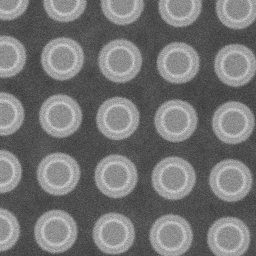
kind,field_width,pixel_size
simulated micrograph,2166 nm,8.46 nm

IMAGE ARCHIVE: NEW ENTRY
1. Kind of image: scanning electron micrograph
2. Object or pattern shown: an array of small figures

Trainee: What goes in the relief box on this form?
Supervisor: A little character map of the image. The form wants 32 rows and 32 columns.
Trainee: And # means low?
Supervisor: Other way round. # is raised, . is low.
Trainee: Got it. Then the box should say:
###...#####..#####..#####..#####
###...####...#####..#####..#####
.......##.....###....###....####
.............................#..
................................
###...####...####....##.........
###..#####...####...####...#####
###..#####..######..#####..#####
###..#####...#####..#####..#####
##....###....####...####...#####
............................###.
................................
##....###.....##................
###..#####..#####...####...####.
###..#####..#####..######..#####
###..#####..#####..######..#####
##....###....####...####...####.
.....................##.....###.
................................
##....###.....#.................
##...#####..#####...####...###..
###..#####..#####..#####..#####.
##...#####..#####..#####..#####.
##...####...#####..#####..#####.
..............#.....###....####.
................................
#.....##........................
##...####...####....###....###..
##..######..#####..#####..#####.
##..######..#####..#####..#####.
##...####...####...#####..#####.
......##.....##.....###....####.